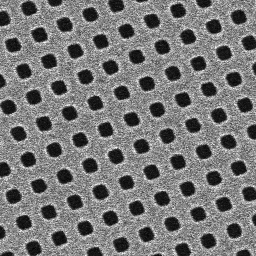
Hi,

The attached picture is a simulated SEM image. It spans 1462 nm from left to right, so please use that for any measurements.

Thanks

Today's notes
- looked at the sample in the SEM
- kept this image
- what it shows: a regular array of holes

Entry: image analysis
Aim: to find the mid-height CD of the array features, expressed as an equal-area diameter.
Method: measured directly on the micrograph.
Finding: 84.5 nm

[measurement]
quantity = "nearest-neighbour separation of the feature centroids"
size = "156 nanometres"